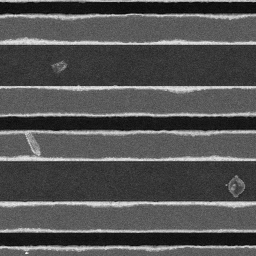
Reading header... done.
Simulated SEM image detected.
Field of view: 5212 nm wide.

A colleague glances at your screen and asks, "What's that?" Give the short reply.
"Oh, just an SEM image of lines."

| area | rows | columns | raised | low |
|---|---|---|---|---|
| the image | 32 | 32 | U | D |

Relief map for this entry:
DDDDDDDDDDDDDDDDDDDDDDDDDDDDDDDD
DDDDDDDDDDDDDDDDDDDDDDDDDDDDDDDD
UUUUUUUUUUUUUUUUUUUUUUUUUUUUUUUU
UUUUUUUUUUUUUUUUUUUUUUUUUUUUUUUU
UUUUUUUUUUUUUUUUUUUUUUUUUUUUUUUU
DDDDDDUUUUDUUUUUUUUUDDDUUUUUUUUU
DDDDDDDDDDDDDDDDDDDDDDDDDDDDDDDD
DDDDDDDDDDDDDDDDDDDDDDDDDDDDDDDD
DDDDDDDDDDDDDDDDDDDDDDDDDDDDDDDD
DDDDDDDDDDDDDDDDDDDDDDDDDDDDDDDD
DDDDDDDDDDDDDDDDDDDDDDDDDDDDDDDD
UUUUUUUUUUUUUUUUUUUUUUUUUUUUUUUU
UUUUUUUUUUUUUUUUUUUUUUUUUUUUUUUU
UUUUUUUUUUUUUUUUUUUUUUUUUUUUUUUU
DDDDDDDDDDDDDDDDDDDDDDDDDDDDDDDD
DDDDDDDDDDDDDDDDDDDDDDDDDDDDDDDD
UUUUUUUUUUUUUUUUUUUUUUUUUUUUUUUU
UUUUUUUUUUUUUUUUUUUUUUUUUUUUUUUU
UUUUUUUUUUUUUUUUUUUUUUUUUUUUUUUU
UUUUUUUUUUUUUUUUUUUUUUUUUUUUUUUU
DDDDDDDDDDDDDDDDDDDDDDDDDDDDDDDD
DDDDDDDDDDDDDDDDDDDDDDDDDDDDDDDD
DDDDDDDDDDDDDDDDDDDDDDDDDDDDDDDD
DDDDDDDDDDDDDDDDDDDDDDDDDDDDDDDD
DDDDDDDDDDDDDDDDDDDDDDDDDDDDDDDD
UUUUUUUUUUUUUUUUUUUUUUUUUUUUUUUU
UUUUUUUUUUUUUUUUUUUUUUUUUUUUUUUU
UUUUUUUUUUUUUUUUUUUUUUUUUUUUUUUU
UUUUUUUUUUUUUUUUUUUUUUUUUUUUUUUU
DDDDDDDDDDDDDDDDDDDDDDDDDDDDDDDD
DDDDDDDDDDDDDDDDDDDDDDDDDDDDDDDD
UUUUUUUUUUUUUUUUUUUUUUUUUUUUUUUU